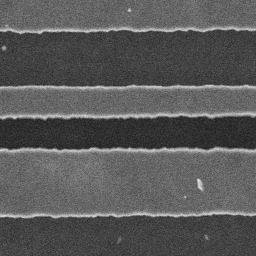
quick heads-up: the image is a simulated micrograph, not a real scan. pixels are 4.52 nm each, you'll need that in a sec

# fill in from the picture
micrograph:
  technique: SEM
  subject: lines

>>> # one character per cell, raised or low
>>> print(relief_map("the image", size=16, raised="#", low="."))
################
################
................
................
................
################
################
................
................
################
################
################
################
##.###.#........
................
................